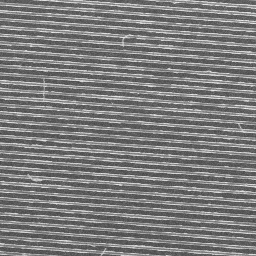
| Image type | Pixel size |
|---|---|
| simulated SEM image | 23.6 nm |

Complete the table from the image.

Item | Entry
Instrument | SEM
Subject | parallel lines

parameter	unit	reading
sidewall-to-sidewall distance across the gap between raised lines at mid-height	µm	0.112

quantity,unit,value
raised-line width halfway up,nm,76.3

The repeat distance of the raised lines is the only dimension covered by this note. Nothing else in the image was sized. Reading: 0.183 microns